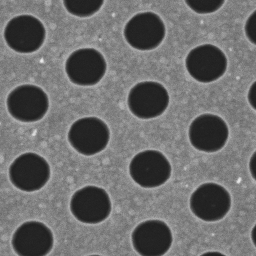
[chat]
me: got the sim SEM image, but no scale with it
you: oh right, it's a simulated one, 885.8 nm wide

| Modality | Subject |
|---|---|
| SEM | a regular array of holes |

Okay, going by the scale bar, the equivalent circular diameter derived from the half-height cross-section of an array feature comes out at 131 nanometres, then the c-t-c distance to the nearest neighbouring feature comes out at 238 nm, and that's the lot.